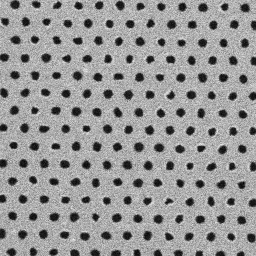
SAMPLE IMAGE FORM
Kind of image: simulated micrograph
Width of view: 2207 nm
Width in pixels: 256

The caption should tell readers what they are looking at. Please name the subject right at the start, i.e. a regular array of holes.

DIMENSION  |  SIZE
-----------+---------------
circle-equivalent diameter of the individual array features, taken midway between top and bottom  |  0.0766 micrometres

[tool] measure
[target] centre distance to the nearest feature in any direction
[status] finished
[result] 171 nm